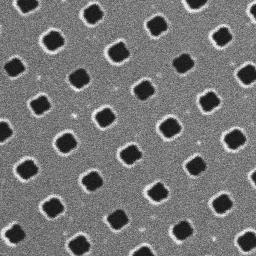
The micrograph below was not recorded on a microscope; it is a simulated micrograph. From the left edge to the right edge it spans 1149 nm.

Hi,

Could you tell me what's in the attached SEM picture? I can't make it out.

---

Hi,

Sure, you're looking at a regular array of holes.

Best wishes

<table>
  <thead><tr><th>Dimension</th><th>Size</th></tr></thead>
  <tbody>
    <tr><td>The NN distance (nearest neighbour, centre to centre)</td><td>206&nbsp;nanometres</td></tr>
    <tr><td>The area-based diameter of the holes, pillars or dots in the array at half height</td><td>87.5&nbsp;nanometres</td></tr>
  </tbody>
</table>